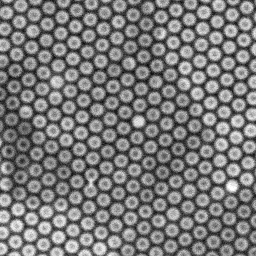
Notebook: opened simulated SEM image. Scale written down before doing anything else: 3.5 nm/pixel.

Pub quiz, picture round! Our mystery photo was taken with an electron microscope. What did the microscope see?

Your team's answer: a regular array of raised bodies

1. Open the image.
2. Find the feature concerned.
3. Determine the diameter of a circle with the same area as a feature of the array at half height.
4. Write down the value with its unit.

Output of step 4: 11.3 px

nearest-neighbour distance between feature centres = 56.2 nm